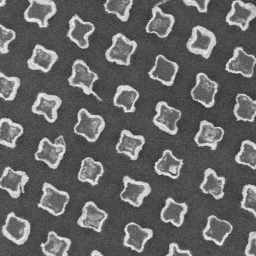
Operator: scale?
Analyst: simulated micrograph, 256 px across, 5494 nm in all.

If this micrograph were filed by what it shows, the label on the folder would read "a regular array of raised bodies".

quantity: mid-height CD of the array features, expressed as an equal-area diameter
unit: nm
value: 528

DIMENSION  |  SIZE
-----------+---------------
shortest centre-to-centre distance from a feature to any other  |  44.6 px